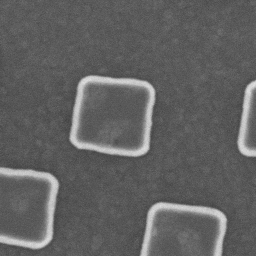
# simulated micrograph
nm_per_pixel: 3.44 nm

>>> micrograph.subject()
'raised bodies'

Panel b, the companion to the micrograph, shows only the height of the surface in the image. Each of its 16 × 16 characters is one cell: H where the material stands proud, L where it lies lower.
LLLLLLLLLLLLLLLL
LLLLLLLLLLLLLLLL
LLLLLLLLLLLLLLLL
LLLLLLLLLLLLLLLL
LLLLLLLLLLLLLLLL
LLLLLHHHHLLLLLLL
LLLLLHHHHLLLLLLH
LLLLLHHHHLLLLLLH
LLLLLHHHHLLLLLLH
LLLLLLLHHLLLLLLH
LLLLLLLLLLLLLLLL
HHHLLLLLLLLLLLLL
HHHLLLLLLLLLLLLL
HHHLLLLLLHHHHHLL
HHHLLLLLLHHHHHLL
LLLLLLLLLHHHHHLL